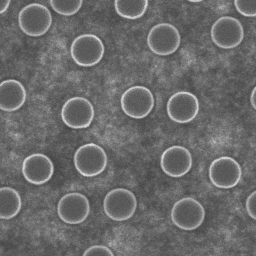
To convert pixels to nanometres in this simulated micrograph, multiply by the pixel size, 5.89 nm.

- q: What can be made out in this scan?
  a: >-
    a regular array of raised bodies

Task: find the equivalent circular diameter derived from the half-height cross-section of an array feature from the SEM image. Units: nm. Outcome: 186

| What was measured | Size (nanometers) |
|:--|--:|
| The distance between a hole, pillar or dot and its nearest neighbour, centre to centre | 294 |